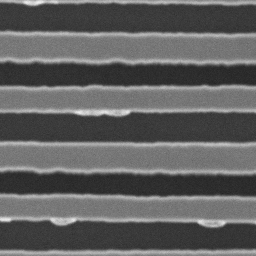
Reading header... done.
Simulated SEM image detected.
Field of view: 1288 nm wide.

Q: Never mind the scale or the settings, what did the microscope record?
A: lines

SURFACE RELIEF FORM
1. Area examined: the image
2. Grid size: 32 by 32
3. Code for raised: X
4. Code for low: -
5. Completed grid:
---XX-------------------XXXXXXX-
--------------------------------
--------------------------------
--------------------------------
XXXXXXXXXXXXXXXXXXXXXXXXXXXXXXXX
XXXXXXXXXXXXXXXXXXXXXXXXXXXXXXXX
XXXXXXXXXXXXXXXXXXXXXXXXXXXXXXXX
XXXXXXXXXXXXXXXXXXXXXXXXXXXXXXXX
--------------------------------
--------------------------------
--------------------------------
XXXXXXXXXXXXXXXXXXXXXXXXXXXXXXXX
XXXXXXXXXXXXXXXXXXXXXXXXXXXXXXXX
XXXXXXXXXXXXXXXXXXXXXXXXXXXXXXXX
--------------------------------
--------------------------------
--------------------------------
--------------------------------
XXXXXXXXXXXXXXXXXXXXXXXXXXXXXXXX
XXXXXXXXXXXXXXXXXXXXXXXXXXXXXXXX
XXXXXXXXXXXXXXXXXXXXXXXXXXXXXXXX
-----X---XXX-X--XXXXXXXXXXXXXXXX
--------------------------------
--------------------------------
XXXXXXXXXXXX-X------------------
XXXXXXXXXXXXXXXXXXXXXXXXXXXXXXXX
XXXXXXXXXXXXXXXXXXXXXXXXXXXXXXXX
X-----XXXX---XXXXXXXXXXXXXXXXXXX
--------------------------------
--------------------------------
--------------------------------
XXXX--XXXXXXXXXXXXXXXXXXXXXXXXXX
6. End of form